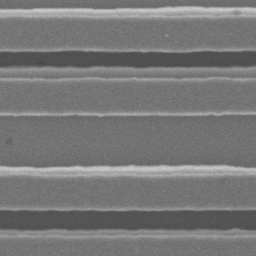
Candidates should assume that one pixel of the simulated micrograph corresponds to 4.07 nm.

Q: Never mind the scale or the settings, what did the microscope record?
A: lines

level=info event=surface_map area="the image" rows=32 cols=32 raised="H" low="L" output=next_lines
LLLLLLLLLLLLLLLLLLLLLLLLLLLLLLLL
HHHHHHHHHHHHHHHHHHHHHHHHHHHHHHHH
HHHHHHHHHHHHHHHHHHHHHHHHHHHHHHHH
HHHHHHHHHHHHHHHHHHHHHHHHHHHHHHHH
HHHHHHHHHHHHHHHHHHHHHHHHHHHHHHHH
HHHHHHHHHHHHHHHHHHHHHHHHHHHHHHHH
LLLLLLLLLLLLLLLLLLLLLLLLLLLLLLLL
LLLLLLLLLLLLLLLLLLLLLLLLLLLLLLLL
LLLLLLLLLLLLHLLLLLLLLLLLLLLLLLLH
HHHHHHHHHHHHHHHHHHHHHHHHHHHHHHHH
HHHHHHHHHHHHHHHHHHHHHHHHHHHHHHHH
HHHHHHHHHHHHHHHHHHHHHHHHHHHHHHHH
HHHHHHHHHHHHHHHHHHHHHHHHHHHHHHHH
HHHHHHHHHHHHHHHHHHHHHHHHHHHHHHHH
LLLLLLLLLLLLLLLLLLLLLLLLLLLLLLLL
LLLLLLLLLLLLLLLLLLLLLLLLLLLLLLLL
LLLLLLLLLLLLLLLLLLLLLLLLLLLLLLLL
LLLLLLLLLLLLLLLLLLLLLLLLLLLLLLLL
LLLLLLLLLLLLLLLLLLLLLLLLLLLLLLLL
LLLLLLLLLLLLLLLLLLLLLLLLLLLLLLLL
LLLLLLLLLLLLLLLLLLLLLLLLLLLLLLLL
HHHHHHHHHHHHHHHHHHHHHHHHHHHHHHHH
HHHHHHHHHHHHHHHHHHHHHHHHHHHHHHHH
HHHHHHHHHHHHHHHHHHHHHHHHHHHHHHHH
HHHHHHHHHHHHHHHHHHHHHHHHHHHHHHHH
HHHHHHHHHHHHHHHHHHHHHHHHHHHHHHHH
LLLLLLLLLLLLLLLLLLLLLLLLLLLLLLLL
LLLLLLLLLLLLLLLLLLLLLLLLLLLLLLLL
LLLLLLLLLLLLLLLLLLLLLLLLLLLLLLLL
HHHHHHHHHHHHHHHHHHHHHHHHHHHHHHHH
HHHHHHHHHHHHHHHHHHHHHHHHHHHHHHHH
HHHHHHHHHHHHHHHHHHHHHHHHHHHHHHHH